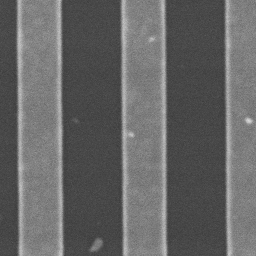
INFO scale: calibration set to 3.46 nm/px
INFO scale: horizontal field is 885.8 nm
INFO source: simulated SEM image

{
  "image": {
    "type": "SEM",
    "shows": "wiring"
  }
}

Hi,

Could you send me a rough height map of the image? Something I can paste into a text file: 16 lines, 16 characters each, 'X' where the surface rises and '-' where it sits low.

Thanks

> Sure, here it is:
-XXX----XX----XX
-XXX----XX----XX
-XXX----XX----XX
-XXX----XX----XX
-XXX----XX----XX
-XXX----XX----XX
-XXX----XX----XX
-XXX----XX----XX
-XXX----XX----XX
-XXX----XX----XX
-XXX----XX----XX
-XXX----XX----XX
-XXX----XX----XX
-XXX----XX----XX
-XXX----XX----XX
-XXX----XX----XX